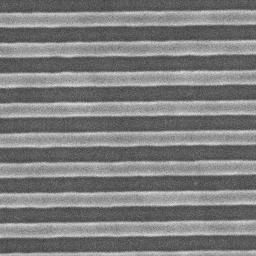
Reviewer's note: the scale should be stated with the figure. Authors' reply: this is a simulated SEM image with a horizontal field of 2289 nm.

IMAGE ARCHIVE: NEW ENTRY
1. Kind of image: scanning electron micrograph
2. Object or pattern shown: wiring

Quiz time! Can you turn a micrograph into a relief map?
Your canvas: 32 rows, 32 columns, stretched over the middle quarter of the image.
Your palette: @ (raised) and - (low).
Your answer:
--------------------------------
--------------------------------
@@@@@@@@@@@@@@@@@@@@@@@@@@@@@@@@
@@@@@@@@@@@@@@@@@@@@@@@@@@@@@@@@
@@@@@@@@@@@@@@@@@@@@@@@@@@@@@@@@
--------------------------------
--------------------------------
--------------------------------
--------------------------------
----------------------@@@@@@@@@@
@@@@@@@@@@@@@@@@@@@@@@@@@@@@@@@@
@@@@@@@@@@@@@@@@@@@@@@@@@@@@@@@@
@@@@@@@@@@@@@@@@@@@@@@@@@@@@@@@@
--------------------------------
--------------------------------
--------------------------------
--------------------------------
@@@@@@@@@@@@@@@@@@@@@@@@@@@@@@@@
@@@@@@@@@@@@@@@@@@@@@@@@@@@@@@@@
@@@@@@@@@@@@@@@@@@@@@@@@@@@@@@@@
--------------------------------
--------------------------------
--------------------------------
--------------------------------
--------------------------------
@@@@@@@@@@@@@@@@@@@@@@@@@@@@@@@@
@@@@@@@@@@@@@@@@@@@@@@@@@@@@@@@@
@@@@@@@@@@@@@@@@@@@@@@@@@@@@@@@@
--------------------------------
--------------------------------
--------------------------------
--------------------------------